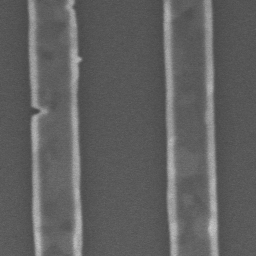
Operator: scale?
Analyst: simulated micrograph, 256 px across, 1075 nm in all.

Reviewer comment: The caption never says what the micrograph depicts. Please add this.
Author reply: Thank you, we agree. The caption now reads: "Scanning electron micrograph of one or a few lines or trenches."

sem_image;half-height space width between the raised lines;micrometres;0.392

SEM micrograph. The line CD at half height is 178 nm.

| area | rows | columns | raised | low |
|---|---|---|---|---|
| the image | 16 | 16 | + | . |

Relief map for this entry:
..++......+++...
..+++.....+++...
..+++.....+++...
..+++.....+++...
..+++.....+++...
..+++......++...
..+++......++...
..+++......++...
..+++......++...
..+++......++...
..+++......++...
..+++......++...
..+++......++...
..+++......++...
..+++......++...
..+++......++...